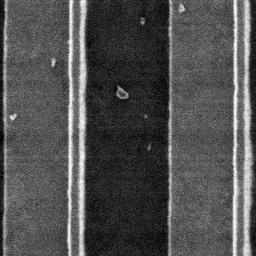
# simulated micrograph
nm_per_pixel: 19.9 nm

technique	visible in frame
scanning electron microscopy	lines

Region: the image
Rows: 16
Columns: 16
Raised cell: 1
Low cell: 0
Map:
1111100000011110
1111100000011110
1111100000011110
1111100000011110
1111100000011110
1111100000011110
1111100000011110
1111100000011110
1111100000011110
1111100000011110
1111100000011110
1111100000011110
1111100000011110
1111100000011110
1111100000011110
1111100000011110